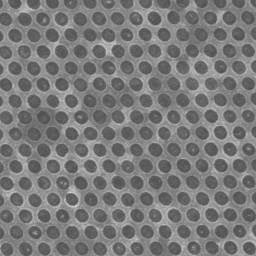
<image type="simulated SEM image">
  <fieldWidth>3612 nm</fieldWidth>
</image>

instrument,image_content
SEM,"a regular array of holes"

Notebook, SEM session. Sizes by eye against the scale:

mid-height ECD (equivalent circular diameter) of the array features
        14.2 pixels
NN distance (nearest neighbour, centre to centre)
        258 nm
